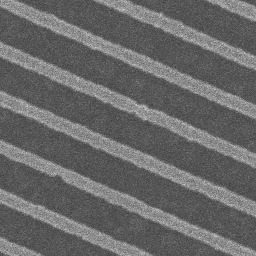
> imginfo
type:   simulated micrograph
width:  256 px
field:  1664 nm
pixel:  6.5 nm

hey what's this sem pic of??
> parallel lines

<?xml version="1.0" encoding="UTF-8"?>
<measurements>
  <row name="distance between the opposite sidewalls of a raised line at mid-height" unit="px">12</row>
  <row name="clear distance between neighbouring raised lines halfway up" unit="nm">210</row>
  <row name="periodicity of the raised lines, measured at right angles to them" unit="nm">291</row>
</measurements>